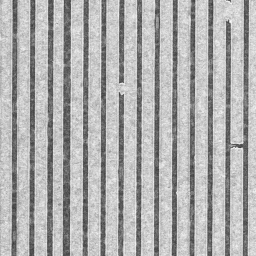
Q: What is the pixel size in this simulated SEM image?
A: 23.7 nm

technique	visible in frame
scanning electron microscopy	parallel lines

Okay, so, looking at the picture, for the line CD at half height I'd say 284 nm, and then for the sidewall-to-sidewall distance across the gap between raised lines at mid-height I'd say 0.136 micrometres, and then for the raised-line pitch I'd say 421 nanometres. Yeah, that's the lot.